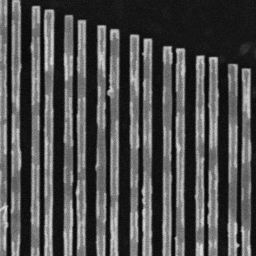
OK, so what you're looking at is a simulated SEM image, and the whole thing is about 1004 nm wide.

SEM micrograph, parallel lines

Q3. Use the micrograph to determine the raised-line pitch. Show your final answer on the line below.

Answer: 64.9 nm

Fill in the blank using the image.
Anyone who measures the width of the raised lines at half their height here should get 30.9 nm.